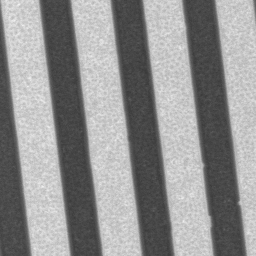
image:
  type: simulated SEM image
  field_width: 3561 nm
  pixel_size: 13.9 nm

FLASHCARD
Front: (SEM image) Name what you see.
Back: one or a few lines or trenches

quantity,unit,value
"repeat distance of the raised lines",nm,988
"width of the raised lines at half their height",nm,573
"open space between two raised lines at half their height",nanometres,411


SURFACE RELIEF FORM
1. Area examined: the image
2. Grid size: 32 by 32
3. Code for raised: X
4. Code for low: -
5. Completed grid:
XXXXX----XXXXX----XXXXX----XXXXX
XXXXX----XXXXX----XXXXX----XXXXX
XXXXX----XXXXX----XXXXX----XXXXX
XXXXX----XXXXX----XXXXX----XXXXX
XXXXXX---XXXXXX---XXXXX----XXXXX
-XXXXX---XXXXXX---XXXXXX---XXXXX
-XXXXX---XXXXXX----XXXXX----XXXX
-XXXXX----XXXXX----XXXXX----XXXX
-XXXXX----XXXXX----XXXXX----XXXX
-XXXXX----XXXXX----XXXXX----XXXX
-XXXXX----XXXXX----XXXXX----XXXX
-XXXXX----XXXXX----XXXXX----XXXX
-XXXXXX---XXXXXX---XXXXX----XXXX
--XXXXX---XXXXXX---XXXXXX---XXXX
--XXXXX---XXXXXX---XXXXXX----XXX
--XXXXX----XXXXX----XXXXX----XXX
--XXXXX----XXXXX----XXXXX----XXX
--XXXXX----XXXXX----XXXXX----XXX
--XXXXX----XXXXX----XXXXX----XXX
--XXXXX----XXXXX----XXXXX----XXX
--XXXXXX---XXXXX----XXXXX----XXX
---XXXXX---XXXXXX---XXXXXX---XXX
---XXXXX---XXXXXX---XXXXXX---XXX
---XXXXX----XXXXX----XXXXX----XX
---XXXXX----XXXXX----XXXXX----XX
---XXXXX----XXXXX----XXXXX----XX
---XXXXX----XXXXX----XXXXX----XX
---XXXXX----XXXXX----XXXXX----XX
---XXXXXX---XXXXX----XXXXX----XX
----XXXXX---XXXXXX---XXXXXX---XX
----XXXXX----XXXXX---XXXXXX---XX
----XXXXX----XXXXX----XXXXX----X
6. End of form